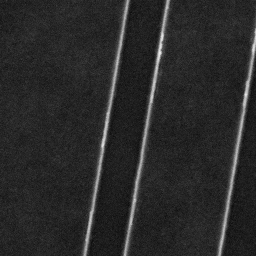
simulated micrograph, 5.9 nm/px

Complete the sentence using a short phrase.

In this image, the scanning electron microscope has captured one or a few lines or trenches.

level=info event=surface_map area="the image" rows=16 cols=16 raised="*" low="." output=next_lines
********..******
********..******
********..******
*******...******
*******...******
*******...******
*******..******.
*******..******.
*******..******.
******...******.
******...******.
******...*****..
******..******..
******..******..
******..******..
*****...******..